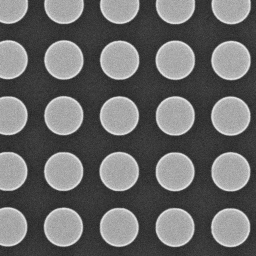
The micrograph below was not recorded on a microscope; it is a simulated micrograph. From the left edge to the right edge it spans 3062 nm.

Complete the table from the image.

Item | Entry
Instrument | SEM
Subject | an array of small figures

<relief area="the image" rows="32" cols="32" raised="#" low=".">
###...####...####...####..#####.
###...####...####...####...####.
##.....##.....##....###....###..
................................
................................
##.....##.....##.....##.....##..
###...####...####...####...####.
###...####...####...####..#####.
###...####...####...####...####.
##.....##.....##.....##....###..
................................
................................
##.....##.....##.....##.....##..
###...####...####...####...####.
###...####...####...####..#####.
###...####...####...####...####.
##.....##.....##.....##....###..
................................
................................
##.....##.....##.....##....###..
###...####...####...####...####.
###...####...####...####...####.
###...####...####...####...####.
##.....##.....##.....##.....##..
................................
................................
##....###....###....###....###..
###...####...####...####...####.
###...####...####...####..#####.
###...####...####...####...####.
##.....##.....##.....##.....##..
................................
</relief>